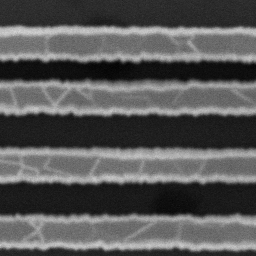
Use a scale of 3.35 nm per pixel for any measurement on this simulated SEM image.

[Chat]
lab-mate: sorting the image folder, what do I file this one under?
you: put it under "lines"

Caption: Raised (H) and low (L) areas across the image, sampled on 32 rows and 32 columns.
LLLLLLLLLLLLLLLLLLLLLLLLLLLLLLLL
LLLLLLLLLLLLLLLLLLLLLLLLLLLLLLLL
LLLLLLLLLLLLLLLLLLLLLLLLLLLLLLLL
LLLLLLLLLLLLLLLLLLLLLLLLLLLLLLLL
HHHHHHHHHHHHHHHHHHHHHHHHHHHHHHHH
HHHHHHHHHHHHHHHHHHHHHHHHHHHHHHHH
HHHHHHHHHHHHHHHHHHHHHHHHHHHHHHHH
HHLLLHLLLHHHHHLHHHHLHHHHHLHHHHHH
LLLLLLLLLLLLLLLLLLLLLLLLLLLLLLLL
LLLLLLLLLLLLLLLLLLLLLLLLLLLLLLLL
HHHHHHHHHHHHHLLLLLHLLHHHHHHHHHLH
HHHHHHHHHHHHHHHHHHHHHHHHHHHHHHHH
HHHHHHHHHHHHHHHHHHHHHHHHHHHHHHHH
HHHHHHHHHHHHHHHHHHHHHHHHHHHHHHHH
LLLLLLLLLLLLLLLLLLLLLLLLLLLLLLLL
LLLLLLLLLLLLLLLLLLLLLLLLLLLLLLLL
LLLLLLLLLLLLLLLLLLLLLLLLLLLLLLLL
LLLLLLLLLLLLLLLLLLLLLLLLLLLLLLLL
LLLLLLLLLLLLLLLLLLLLLLLLLLLLLLLL
HHHHHHHHHHHHHHHHHHHHHHHHHHHHHHHH
HHHHHHHHHHHHHHHHHHHHHHHHHHHHHHHH
HHHHHHHHHHHHHHHHHHHHHHHHHHHHHHHH
HHHHHHHHHHHHHHHHHHHHHHHHHHHHHHHH
LLLLLLLLLLLLLLLLLLLLLLLLLLLLLLLL
LLLLLLLLLLLLLLLLLLLLLLLLLLLLLLLL
LLLLLLLLLLLLLLLLLLLLLLLLLLLLLLLL
LLLLLLLLLLLLLLLLLLLLLLLLLLLLLLLL
HHHHHHHHHHHHHHHHHHHHHHHHHHHHHHHH
HHHHHHHHHHHHHHHHHHHHHHHHHHHHHHHH
HHHHHHHHHHHHHHHHHHHHHHHHHHHHHHHH
HHHHHHHHHHHHHHHHHHHHHHHHHHHHHHHH
LLLLLLLLLLLLLLLLLLLLLLLLLLLLLLLL